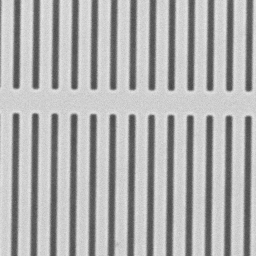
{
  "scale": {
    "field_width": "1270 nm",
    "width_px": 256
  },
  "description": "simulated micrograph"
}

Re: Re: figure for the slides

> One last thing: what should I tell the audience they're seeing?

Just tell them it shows groups of lines, slits or small figures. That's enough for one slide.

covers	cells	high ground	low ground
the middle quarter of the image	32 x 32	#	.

##..##...##..###..###..###..###.
##..##...##..###..###..###..###.
##..##...##..###..###..###..###.
##..##...##..###..###..###..###.
##..##...##..###..###..###..###.
##..##...##..###..###..###..###.
#######.####.####.###.####..###.
################################
################################
################################
################################
################################
##.####.####.###################
##..##..###..###..###..###..###.
#..###..###..###..###..###..###.
#..###..###..###..###..###..###.
#..###..###..###..###..###..###.
#..###..###..###..###..###..###.
#..###..###..###..###..###..##..
#..###..###..###..###..###..##..
#..###..###..###..###..###..##..
#..###..###..###..###..###..##..
#..###..###..###..###..###..##..
#..###..###..###..###..###..##..
#..###..###..###..###..###..##..
#..###..###..###..###..###..##..
#..###..###..###..###..###..##..
#..###..###..###..###..###..##..
#..###..###..###..###..###..##..
#..###..###..###..###..###..##..
#..###..###..###..###..###..##..
#..###..###..###..###..###..##..